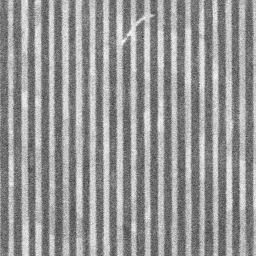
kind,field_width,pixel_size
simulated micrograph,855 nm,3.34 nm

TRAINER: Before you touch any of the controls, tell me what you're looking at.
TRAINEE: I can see parallel lines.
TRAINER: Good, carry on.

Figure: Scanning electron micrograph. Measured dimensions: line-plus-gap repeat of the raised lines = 0.0455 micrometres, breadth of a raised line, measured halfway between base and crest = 0.015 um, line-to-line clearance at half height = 29.6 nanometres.